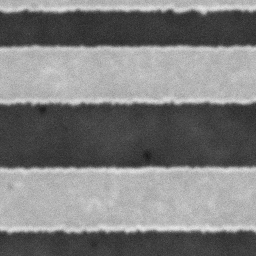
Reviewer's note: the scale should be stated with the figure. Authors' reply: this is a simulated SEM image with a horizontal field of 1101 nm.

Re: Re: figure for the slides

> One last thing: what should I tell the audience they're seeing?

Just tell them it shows lines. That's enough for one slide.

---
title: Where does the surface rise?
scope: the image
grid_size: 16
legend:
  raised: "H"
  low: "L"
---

HHHHHHHHHHHHHHHH
LLLLLLLLLLLLLLLL
LLLLLLLLLLLLLLLL
HHHHHHHHHHHHHHHH
HHHHHHHHHHHHHHHH
HHHHHHHHHHHHHHHH
LLLLLLLLLLLLLLLL
LLLLLLLLLLLLLLLL
LLLLLLLLLLLLLLLL
LLLLLLLLLLLLLLLL
LLLLLLLLLHLLLLLL
HHHHHHHHHHHHHHHH
HHHHHHHHHHHHHHHH
HHHHHHHHHHHHHHHH
LLLLLLLLLLLLLLLL
LLLLLLLLLLLLLLLL